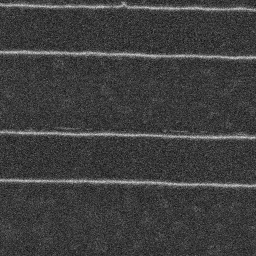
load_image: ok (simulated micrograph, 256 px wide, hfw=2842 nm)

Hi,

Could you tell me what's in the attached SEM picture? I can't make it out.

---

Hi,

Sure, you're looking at one or a few lines or trenches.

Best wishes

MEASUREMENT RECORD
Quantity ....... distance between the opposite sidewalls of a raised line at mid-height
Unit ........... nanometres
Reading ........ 530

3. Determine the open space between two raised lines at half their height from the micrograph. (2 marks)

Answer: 0.891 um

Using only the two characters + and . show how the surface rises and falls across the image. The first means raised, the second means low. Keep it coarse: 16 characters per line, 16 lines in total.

+++++++++.......
++++++++++++++++
++++++++++++++++
............++++
................
................
................
................
++++++++++......
++++++++++++++++
++++++++++++++++
............++++
................
................
................
................